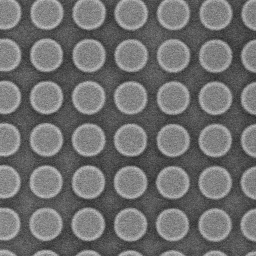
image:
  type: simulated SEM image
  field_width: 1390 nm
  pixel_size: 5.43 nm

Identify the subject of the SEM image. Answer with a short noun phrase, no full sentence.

an array of small figures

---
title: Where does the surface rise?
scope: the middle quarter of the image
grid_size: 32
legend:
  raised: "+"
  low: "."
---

...++++++.....++++++....++++++..
....++++.......++++......++++...
................................
................................
.....++.........++..............
...++++++.....+++++......+++++..
...+++++++...+++++++....+++++++.
..++++++++...++++++++..++++++++.
..++++++++...++++++++..++++++++.
..++++++++...++++++++..++++++++.
...+++++++...+++++++....+++++++.
...++++++.....+++++.....++++++..
................................
................................
................................
....++++.......+++.......++++...
...++++++....+++++++....++++++..
..++++++++...+++++++....+++++++.
..++++++++...++++++++..++++++++.
..++++++++...++++++++..++++++++.
..++++++++...+++++++...++++++++.
...++++++....+++++++....++++++..
....++++.......++++......++++...
................................
................................
................................
....+++++.....+++++......+++++..
...+++++++...+++++++....+++++++.
..++++++++...++++++++..++++++++.
..++++++++...++++++++..++++++++.
..++++++++...++++++++..++++++++.
...+++++++...+++++++....+++++++.